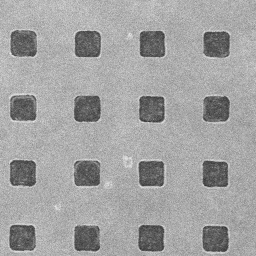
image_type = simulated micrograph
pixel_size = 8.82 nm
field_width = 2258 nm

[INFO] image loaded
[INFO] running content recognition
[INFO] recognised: a regular array of holes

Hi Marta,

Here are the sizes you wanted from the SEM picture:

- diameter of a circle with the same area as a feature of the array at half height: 262 nm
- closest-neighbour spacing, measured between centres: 64 pixels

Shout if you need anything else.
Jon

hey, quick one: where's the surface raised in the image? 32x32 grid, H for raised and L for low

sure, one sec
HHHHHHHHHHHHHHHHHHHHHHHHHHHHHHHH
HHHHHHHHHHHHHHHHHHHHHHHHHHHHHHHH
HHHHHHHHHHHHHHHHHHHHHHHHHHHHHHHH
HHHHHHHHHHHHHHHHHHHHHHHHHHHHHHHH
HLLLLHHHHLLLLHHHHLLLLHHHHLLLLHHH
HLLLLHHHHLLLLHHHHLLLLHHHHLLLLHHH
HLLLLHHHHLLLLHHHHLLLLHHHHLLLLHHH
HHHHHHHHHHHHHHHHHHHHHHHHHHHHHHHH
HHHHHHHHHHHHHHHHHHHHHHHHHHHHHHHH
HHHHHHHHHHHHHHHHHHHHHHHHHHHHHHHH
HHHHHHHHHHHHHHHHHHHHHHHHHHHHHHHH
HHHHHHHHHHHHHHHHHHHHHHHHHHHHHHHH
HLLLLHHHHLLLLHHHHLLLLHHHHLLLLHHH
HLLLLHHHHLLLLHHHHLLLLHHHHLLLLHHH
HLLLLHHHHLLLLHHHHLLLLHHHHLLLLHHH
HHHHHHHHHHHHHHHHHHHHHHHHHHHHHHHH
HHHHHHHHHHHHHHHHHHHHHHHHHHHHHHHH
HHHHHHHHHHHHHHHHHHHHHHHHHHHHHHHH
HHHHHHHHHHHHHHHHHHHHHHHHHHHHHHHH
HHHHHHHHHHHHHHHHHHHHHHHHHHHHHHHH
HLLLHHHHHLLLHHHHHLLLHHHHHLLLHHHH
HLLLLHHHHLLLLHHHHLLLLHHHHLLLLHHH
HLLLHHHHHLLLHHHHHLLLLHHHHLLLLHHH
HHHHHHHHHHHHHHHHHHHHHHHHHHLLHHHH
HHHHHHHHHHHHHHHHHHHHHHHHHHHHHHHH
HHHHHHHHHHHHHHHHHHHHHHHHHHHHHHHH
HHHHHHHHHHHHHHHHHHHHHHHHHHHHHHHH
HHHHHHHHHHHHHHHHHHHHHHHHHHHHHHHH
HLLLHHHHHLLLHHHHHLLLHHHHHLLLHHHH
HLLLLHHHHLLLLHHHHLLLLHHHHLLLLHHH
HLLLLHHHHLLLLHHHHLLLLHHHHLLLLHHH
HHHHHHHHHHHHHHHHHHLLHHHHHHLLHHHH